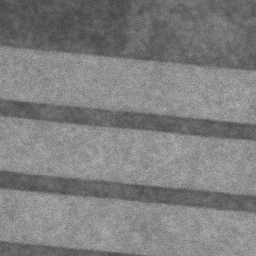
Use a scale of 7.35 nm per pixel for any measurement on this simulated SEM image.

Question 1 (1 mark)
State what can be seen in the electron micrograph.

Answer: one or a few lines or trenches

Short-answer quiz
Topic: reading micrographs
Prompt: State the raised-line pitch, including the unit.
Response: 510 nm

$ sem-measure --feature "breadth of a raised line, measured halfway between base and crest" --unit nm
383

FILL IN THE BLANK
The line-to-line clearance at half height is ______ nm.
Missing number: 132